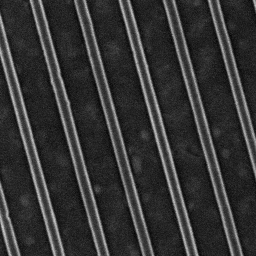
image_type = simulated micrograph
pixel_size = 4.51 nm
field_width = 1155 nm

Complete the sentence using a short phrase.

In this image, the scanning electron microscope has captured parallel lines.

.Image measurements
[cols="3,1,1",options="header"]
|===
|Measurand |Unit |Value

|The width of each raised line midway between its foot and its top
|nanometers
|44.7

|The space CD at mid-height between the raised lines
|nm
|151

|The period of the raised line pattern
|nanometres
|194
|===